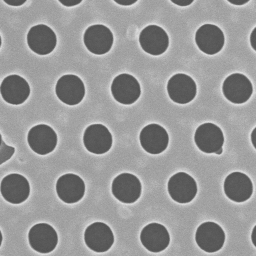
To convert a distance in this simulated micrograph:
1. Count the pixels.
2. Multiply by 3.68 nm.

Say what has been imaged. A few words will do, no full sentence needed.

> a regular array of holes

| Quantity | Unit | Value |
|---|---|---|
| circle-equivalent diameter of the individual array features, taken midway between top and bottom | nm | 111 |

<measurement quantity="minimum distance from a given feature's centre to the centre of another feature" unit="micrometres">0.205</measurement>